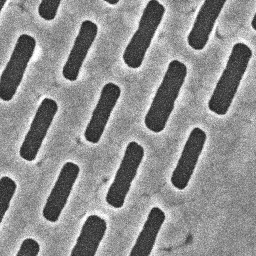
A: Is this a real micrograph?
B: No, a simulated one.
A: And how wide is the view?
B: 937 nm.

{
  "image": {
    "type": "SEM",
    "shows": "a regular array of holes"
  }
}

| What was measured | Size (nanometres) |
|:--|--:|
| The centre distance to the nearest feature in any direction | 241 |